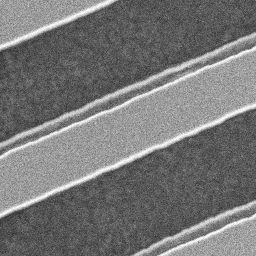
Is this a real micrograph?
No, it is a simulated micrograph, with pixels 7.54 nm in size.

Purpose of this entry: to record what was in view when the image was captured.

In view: lines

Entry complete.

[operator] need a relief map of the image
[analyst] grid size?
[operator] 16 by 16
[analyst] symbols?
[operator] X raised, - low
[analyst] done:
XXXXXX----------
XXXX------------
X--------------X
-------------XXX
-----------XXXXX
---------XXXXXXX
------XXXXXXXXXX
----XXXXXXXXXX--
--XXXXXXXXX-----
XXXXXXXXX-------
XXXXXXX---------
XXXXX-----------
XX--------------
---------------X
------------XXXX
---------XXXXXXX